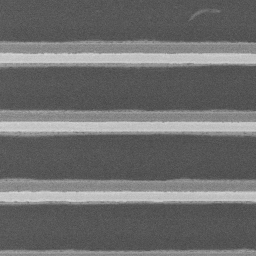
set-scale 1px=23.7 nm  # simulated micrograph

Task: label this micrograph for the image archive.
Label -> lines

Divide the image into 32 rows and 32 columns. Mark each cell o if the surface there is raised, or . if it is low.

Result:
................................
................................
................................
................................
................................
oooooooooooooooooooooooooooooooo
oooooooooooooooooooooooooooooooo
oooooooooooooooooooooooooooooooo
................................
................................
................................
................................
................................
................................
oooooooooooooooooooooooooooooooo
oooooooooooooooooooooooooooooooo
................................
................................
................................
................................
................................
................................
................................
oooooooooooooooooooooooooooooooo
oooooooooooooooooooooooooooooooo
................................
................................
................................
................................
................................
................................
...................o.........ooo